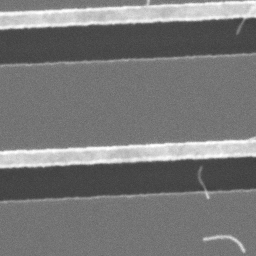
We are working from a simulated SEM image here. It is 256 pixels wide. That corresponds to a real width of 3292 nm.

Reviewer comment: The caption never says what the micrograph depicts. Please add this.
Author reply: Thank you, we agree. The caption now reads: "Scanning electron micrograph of lines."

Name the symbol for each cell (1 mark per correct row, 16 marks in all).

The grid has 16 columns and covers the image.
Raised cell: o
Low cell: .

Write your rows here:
oooooooooooooooo
oooooo..........
................
..............oo
oooooooooooooooo
oooooooooooooooo
oooooooooooooooo
oooooooooooooooo
oooooooooooooooo
oooooooooooooooo
................
................
..oooooooooooooo
oooooooooooooooo
oooooooooooooooo
oooooooooooooooo